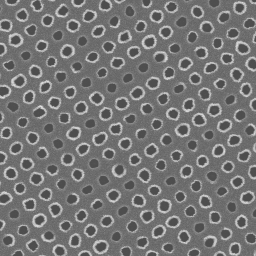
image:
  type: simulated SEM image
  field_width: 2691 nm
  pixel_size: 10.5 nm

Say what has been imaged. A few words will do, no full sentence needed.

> a regular array of holes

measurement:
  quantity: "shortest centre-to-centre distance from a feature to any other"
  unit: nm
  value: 189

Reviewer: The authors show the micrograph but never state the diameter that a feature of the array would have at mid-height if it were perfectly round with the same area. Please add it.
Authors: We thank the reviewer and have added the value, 96.3 nm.